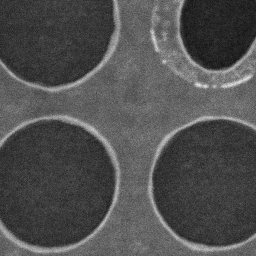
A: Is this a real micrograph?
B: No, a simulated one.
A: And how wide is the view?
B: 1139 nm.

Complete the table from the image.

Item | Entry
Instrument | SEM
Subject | holes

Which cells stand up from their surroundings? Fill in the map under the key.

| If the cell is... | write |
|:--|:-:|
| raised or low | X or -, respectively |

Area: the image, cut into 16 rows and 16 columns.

-------XXXX-----
-------XXXX-----
-------XXXX-----
-------XXXXX---X
X-----XXXXXXXXXX
XXXXXXXXXXXXXXXX
XXXXXXXXXXXXXXXX
XX--XXXXXXXXX-XX
X-----XXXXX-----
-------XXX------
-------XXX------
-------XX-------
-------XXX------
-------XXX------
------XXXXX-----
XX--XXXXXXXXXXXX